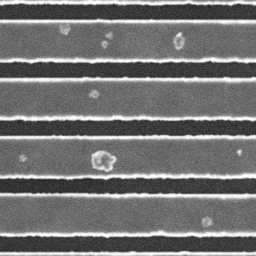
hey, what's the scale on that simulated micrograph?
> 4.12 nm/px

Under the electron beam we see lines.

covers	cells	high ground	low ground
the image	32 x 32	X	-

------------------XXX---XX--X--X
--------------------------------
--------------------------------
XXXXXXXXXXXXXXXXXXXXXXXXXXXXXXXX
XXXXXXXXXXXXXXXXXXXXXXXXXXXXXXXX
XXXXXXXXXXXXXXXXXXXXXXXXXXXXXXXX
XXXXXXXXXXXXXXXXXXXXXXXXXXXXXXXX
XXXXXXXXXXXXXXXXXXXXXXXXXXXXXXXX
--------------------------------
--------------------------------
XXXXXXXXXXXXXXXXXXXXXXXXXXXXXXXX
XXXXXXXXXXXXXXXXXXXXXXXXXXXXXXXX
XXXXXXXXXXXXXXXXXXXXXXXXXXXXXXXX
XXXXXXXXXXXXXXXXXXXXXXXXXXXXXXXX
XXXXXXXXXXXXXXXXXXXXXXXXXXXXXXXX
--------------------------------
--------------------------------
XXXXXXXXXXXXXXXXXXXXXXXXXXXXXXXX
XXXXXXXXXXXXXXXXXXXXXXXXXXXXXXXX
XXXXXXXXXXXXXXXXXXXXXXXXXXXXXXXX
XXXXXXXXXXXXXXXXXXXXXXXXXXXXXXXX
XXXXXXXXXXXXXXXXXXXXXXXXXXXXXXXX
--------------------------------
--------------------------------
XXXXXXXXXXXXXXXXXXXXXXXXXXXXXXXX
XXXXXXXXXXXXXXXXXXXXXXXXXXXXXXXX
XXXXXXXXXXXXXXXXXXXXXXXXXXXXXXXX
XXXXXXXXXXXXXXXXXXXXXXXXXXXXXXXX
XXXXXXXXXXXXXXXXXXXXXXXXXXXXXXXX
XXXX-XXXX-X--XXXXXX--XXXXXXX---X
--------------------------------
----------------------XX--------